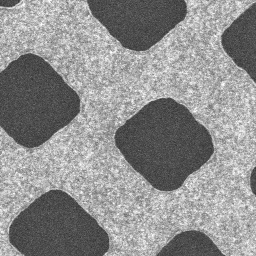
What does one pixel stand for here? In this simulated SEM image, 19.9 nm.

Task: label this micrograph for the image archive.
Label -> holes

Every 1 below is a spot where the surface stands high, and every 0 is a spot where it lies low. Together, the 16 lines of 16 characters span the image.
1111110000001110
1111110000011100
1111111000111100
1011111111111100
0000111111111110
0000111111111111
0000011110011111
0000011100001111
1001111000000111
1111111100000111
1111111100001111
1111111110011111
1100011111111111
1000001111111111
1000000111100111
1000000111000011